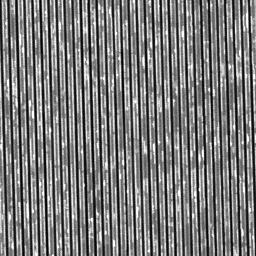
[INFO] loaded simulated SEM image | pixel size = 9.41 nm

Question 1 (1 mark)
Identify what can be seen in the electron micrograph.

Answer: parallel lines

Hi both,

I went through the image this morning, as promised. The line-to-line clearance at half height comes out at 25.9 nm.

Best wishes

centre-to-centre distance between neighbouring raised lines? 75.5 nanometers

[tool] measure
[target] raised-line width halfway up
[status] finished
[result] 49.4 nm